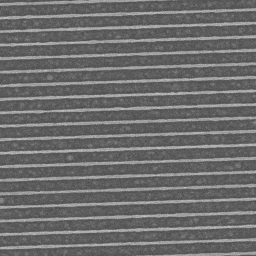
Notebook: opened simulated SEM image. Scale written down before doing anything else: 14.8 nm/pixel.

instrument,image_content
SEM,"parallel lines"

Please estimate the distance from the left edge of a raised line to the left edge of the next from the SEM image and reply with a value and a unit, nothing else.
0.2 microns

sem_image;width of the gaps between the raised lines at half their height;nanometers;164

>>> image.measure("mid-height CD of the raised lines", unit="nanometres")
25.9